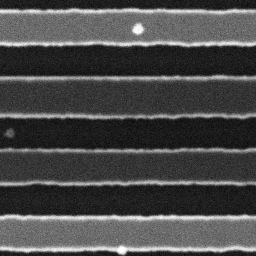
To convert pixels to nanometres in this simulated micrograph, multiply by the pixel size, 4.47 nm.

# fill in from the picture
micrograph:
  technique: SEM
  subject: lines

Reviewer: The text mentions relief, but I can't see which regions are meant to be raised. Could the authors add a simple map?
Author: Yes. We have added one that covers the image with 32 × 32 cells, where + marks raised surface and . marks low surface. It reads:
................................
++++++++++++++++++++++++++++++++
++++++++++++++++++++++++++++++++
++++++++++++++++++++++++++++++++
++++++++++++++++++++++++++++++++
++++++++++++.+++++++++++++++++++
................................
................................
................................
................................
++++++++++++++++++++++++++++++++
++++++++++++++++++++++++++++++++
++++++++++++++++++++++++++++++++
++++++++++++++++++++++++++++++++
++++++++++++++++++++++++++++++++
................................
................................
................................
................................
++++++++++++++++++++++++++++++++
++++++++++++++++++++++++++++++++
++++++++++++++++++++++++++++++++
++++++++++++++++++++++++++++++++
................................
................................
................................
................................
++++++++++++++++++++++++++++++++
++++++++++++++++++++++++++++++++
++++++++++++++++++++++++++++++++
++++++++++++++++++++++++++++++++
...............+................